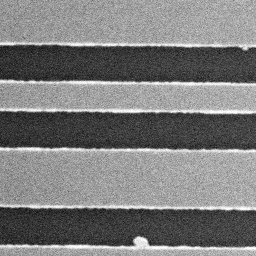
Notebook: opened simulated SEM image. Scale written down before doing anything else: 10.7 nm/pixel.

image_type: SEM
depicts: lines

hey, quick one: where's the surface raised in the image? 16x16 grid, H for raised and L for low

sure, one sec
HHHHHHHHHHHHHHHH
HHHHHHHHHHHHHHHH
HHHHHHHHHHHHHHHH
LLLLLLLLLLLLLLLL
LLLLLLLLLLLLLLLL
HHHHHHHHHHHHHHHH
HHHHHHHHHHHHHHHH
LLLLLLLLLLLLLLLL
LLLLLLLLLLLLLLLL
HHHHHHHHHHHHHHHH
HHHHHHHHHHHHHHHH
HHHHHHHHHHHHHHHH
HHHHHHHHHHHHHHHH
LLLLLLLLLLLLLLLL
LLLLLLLLLLLLLLLL
HHHHHHHHHHHHLLLL